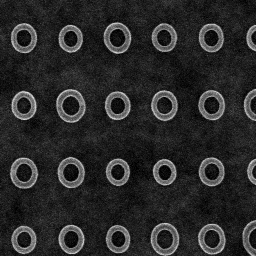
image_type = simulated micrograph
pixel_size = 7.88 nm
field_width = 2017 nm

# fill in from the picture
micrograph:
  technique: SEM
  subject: a regular array of ring-shaped raised bodies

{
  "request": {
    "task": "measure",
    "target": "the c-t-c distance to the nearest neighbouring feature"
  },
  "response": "371 nanometres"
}